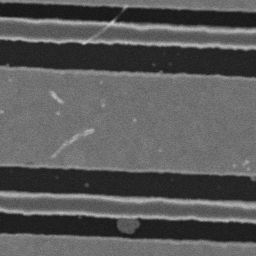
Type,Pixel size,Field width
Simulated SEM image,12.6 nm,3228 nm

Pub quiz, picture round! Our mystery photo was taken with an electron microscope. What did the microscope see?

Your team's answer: lines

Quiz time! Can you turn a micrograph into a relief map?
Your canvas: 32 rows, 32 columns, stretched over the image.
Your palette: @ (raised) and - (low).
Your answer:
-------@@@@@@@@@@@@@@@@@@@@@@@@@
--------------------------------
@@@@@@@@------------------------
@@@@@@@@@@@@@@@@@@@@@@@@@@@@----
@@@@@@@@@@@@@@@@@@@@@@@@@@@@@@@@
-----------------@@@@@@@@@@@@@@@
--------------------------------
--------------------------------
@-@@----------------------------
@@@@@@@@@@@@@@@@@@@@@@@@@@@@----
@@@@@@@@@@@@@@@@@@@@@@@@@@@@@@@@
@@@@@@@@@@@@@@@@@@@@@@@@@@@@@@@@
@@@@@@@@@@@@@@@@@@@@@@@@@@@@@@@@
@@@@@@@@@@@@@@@@@@@@@@@@@@@@@@@@
@@@@@@@@@@@@@@@@@@@@@@@@@@@@@@@@
@@@@@@@@@@@@@@@@@@@@@@@@@@@@@@@@
@@@@@@@@@@@@@@@@@@@@@@@@@@@@@@@@
@@@@@@@@@@@@@@@@@@@@@@@@@@@@@@@@
@@@@@@@@@@@@@@@@@@@@@@@@@@@@@@@@
@@@@@@@@@@@@@@@@@@@@@@@@@@@@@@@@
@@@@@@@@@@@@@@@@@@@@@@@@@@@@@@@@
----------------------@@@@@@@@@@
--------------------------------
--------------------------------
@@@@@@@@@@@@--------------------
@@@@@@@@@@@@@@@@@@@@@@@@@@@@@@@@
@@@@@@@@@@@@@@@@@@@@@@@@@@@@@@@@
---------------------@@-@@@@@@@@
--------------------------------
@@@@@@@@@-----------------------
@@@@@@@@@@@@@@@@@@@@@@@@@@@@@@@@
@@@@@@@@@@@@@@@@@@@@@@@@@@@@@@@@